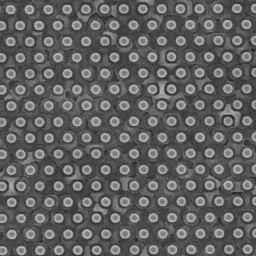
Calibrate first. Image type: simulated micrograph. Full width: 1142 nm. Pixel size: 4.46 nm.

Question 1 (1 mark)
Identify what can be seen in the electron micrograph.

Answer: a regular array of raised bodies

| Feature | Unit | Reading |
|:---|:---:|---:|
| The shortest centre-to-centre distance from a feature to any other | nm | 82.1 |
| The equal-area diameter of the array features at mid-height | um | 0.0387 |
